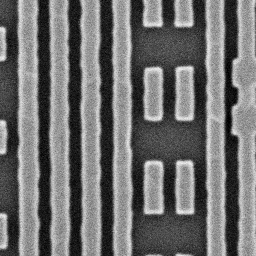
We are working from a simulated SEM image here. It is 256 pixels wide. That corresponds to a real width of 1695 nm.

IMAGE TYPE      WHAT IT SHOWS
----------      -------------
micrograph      wiring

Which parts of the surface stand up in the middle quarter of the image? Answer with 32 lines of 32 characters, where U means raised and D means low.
UDDDUUUUUDDDUUUUDDDDDDDDDDDDDDDD
UDDDDUUUUDDDDUUUDDDDUUUUDDDDUUUU
UDDDDUUUUDDDDUUUDDDDUUUUDDDDUUUU
UDDDDUUUUDDDDUUUDDDDUUUUUDDDUUUU
UDDDDUUUUDDDDUUUDDDDUUUUUDDDUUUU
UDDDDUUUUDDDDUUUUDDDUUUUDDDDUUUU
UDDDDUUUUDDDDUUUUDDDUUUUUDDDUUUU
UDDDDUUUUDDDDUUUUDDDUUUUUDDDUUUU
UDDDDUUUUDDDUUUUUDDDUUUUDDDDUUUU
UDDDUUUUUDDDUUUUUDDDUUUUUDDDUUUU
UDDDUUUUUDDDUUUUUDDDUUUUDDDDUUUU
UDDDUUUUUDDDUUUUUDDDUUUUUDDDUUUU
UDDDUUUUUDDDDUUUUDDDUUUUUDDDUUUU
UDDDUUUUUDDDDUUUUDDDUUUUDDDDUUUU
UDDDDUUUUDDDDUUUUDDDDDDDDDDDDDDD
UDDDDUUUUDDDDUUUUDDDDDDDDDDDDDDD
UDDDDUUUUDDDDUUUUDDDDDDDDDDDDDDD
UDDDDUUUUDDDDUUUDDDDDDDDDDDDDDDD
UDDDDUUUUDDDDUUUDDDDDDDDDDDDDDDD
UDDDDUUUUDDDDUUUDDDDDDDDDDDDDDDD
UDDDDUUUUDDDDUUUDDDDDDDDDDDDDDDD
UDDDDUUUUDDDDUUUUDDDDDDDDDDDDDDD
UDDDDUUUUDDDDUUUUDDDDDDDDDDDDDDD
UDDDDUUUUDDDDUUUUDDDDDDDDDDDDDDD
UDDDDUUUUDDDDUUUUDDDDUUUDDDDUUUU
UDDDDUUUUDDDDUUUUDDDUUUUUDDDUUUU
UDDDDUUUUDDDDUUUUDDDUUUUUDDDUUUU
UDDDDUUUUDDDDUUUUDDDUUUUUDDDUUUU
UDDDDUUUUDDDDUUUUDDDUUUUUDDDUUUU
UDDDDUUUUDDDDUUUUDDDUUUUUDDDUUUU
UDDDDUUUUDDDDUUUUDDDUUUUUDDDUUUU
UDDDDUUUUDDDDUUUUDDDUUUUUDDDUUUU